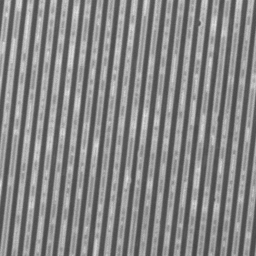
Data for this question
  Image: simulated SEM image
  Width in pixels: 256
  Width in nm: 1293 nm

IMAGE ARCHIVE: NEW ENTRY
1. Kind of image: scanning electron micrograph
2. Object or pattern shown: parallel lines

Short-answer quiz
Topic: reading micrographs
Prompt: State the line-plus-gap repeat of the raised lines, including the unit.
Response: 58.2 nanometers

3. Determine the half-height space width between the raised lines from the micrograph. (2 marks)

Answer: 0.0295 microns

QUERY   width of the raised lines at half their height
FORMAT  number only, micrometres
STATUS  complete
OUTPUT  0.0295